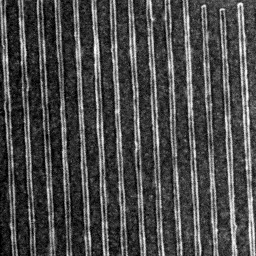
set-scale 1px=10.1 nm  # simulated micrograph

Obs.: parallel lines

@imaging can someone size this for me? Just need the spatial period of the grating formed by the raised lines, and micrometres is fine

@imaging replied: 0.183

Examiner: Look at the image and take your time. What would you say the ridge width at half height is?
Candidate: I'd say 37.6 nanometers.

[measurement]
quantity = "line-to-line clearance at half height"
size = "142 nm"